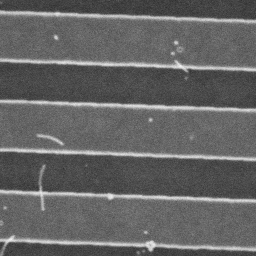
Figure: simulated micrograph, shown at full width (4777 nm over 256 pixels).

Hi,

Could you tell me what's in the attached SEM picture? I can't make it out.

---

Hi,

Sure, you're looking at lines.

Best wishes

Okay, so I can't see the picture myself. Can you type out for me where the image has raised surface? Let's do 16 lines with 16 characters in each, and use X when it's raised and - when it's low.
----------------
XXXXXXXXXXXXXXXX
XXXXXXXXXXXXXXXX
XXXXXXXXXXXXXXXX
----------------
----------------
XXXXXX----------
XXXXXXXXXXXXXXXX
XXXXXXXXXXXXXXXX
--XXXXXXXXXXXXXX
----------------
----------------
XXXXXXXXXXXXXXXX
XXXXXXXXXXXXXXXX
XXXXXXXXXXXXXXXX
-----------XXXXX